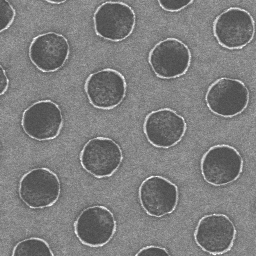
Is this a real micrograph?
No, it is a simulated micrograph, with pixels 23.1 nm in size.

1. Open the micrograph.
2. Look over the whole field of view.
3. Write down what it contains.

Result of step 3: a regular array of raised bodies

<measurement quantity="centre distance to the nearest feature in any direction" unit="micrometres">1.57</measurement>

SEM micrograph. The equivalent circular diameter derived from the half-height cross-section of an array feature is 909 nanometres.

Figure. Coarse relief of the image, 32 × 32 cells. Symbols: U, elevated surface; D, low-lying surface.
UDDDDDDDDDDDDUUDDDDDUUUDDDDDDDDD
UUDDDDDDDDDDUUUUUDDDDDDDDDDDUUUD
UDDDDDDDDDDDUUUUUDDDDDDDDDDUUUUU
UDDDDDDDDDDDUUUUUDDDDDDDDDDUUUUU
DDDDDUUUDDDDDUUUDDDDDDDDDDDUUUUU
DDDDUUUUDDDDDDDDDDDDUUUDDDDDUUUD
DDDDUUUUUDDDDDDDDDDUUUUUDDDDDDDD
DDDDUUUUDDDDDDDDDDDUUUUUDDDDDDDD
DDDDDUUDDDDDDDDDDDDUUUUDDDDDDDDD
UDDDDDDDDDDUUUUDDDDDUUDDDDDDDDDD
UDDDDDDDDDDUUUUUDDDDDDDDDDDUUUDD
DDDDDDDDDDDUUUUUDDDDDDDDDDUUUUUD
DDDDDDDDDDDUUUUDDDDDDDDDDDUUUUUD
DDDDUUUDDDDDDUDDDDDDDDDDDDUUUUUD
DDDUUUUUDDDDDDDDDDDUUUDDDDDDUDDD
DDDUUUUUDDDDDDDDDDUUUUUDDDDDDDDD
DDDUUUUDDDDDDDDDDDUUUUUDDDDDDDDD
DDDDDDDDDDDUUUDDDDDUUUDDDDDDDDDD
DDDDDDDDDDDUUUUDDDDDDDDDDDDUUDDD
DDDDDDDDDDUUUUUDDDDDDDDDDDUUUUDD
DDDDDDDDDDUUUUUDDDDDDDDDDUUUUUDD
DDDDUUDDDDDUUUDDDDDDDDDDDUUUUUDD
DDDUUUUDDDDDDDDDDDUUUDDDDDUUUDDD
DDUUUUUDDDDDDDDDDDUUUUDDDDDDDDDD
DDDUUUUDDDDDDDDDDUUUUUDDDDDDDDDD
DDDUUUDDDDDDDDDDDDUUUUDDDDDDDDDD
DDDDDDDDDDUUUUDDDDUUUDDDDDDDDDDD
DDDDDDDDDDUUUUDDDDDDDDDDDUUUUDDD
DDDDDDDDDUUUUUDDDDDDDDDDDUUUUDDD
DDDDDDDDDDUUUUDDDDDDDDDDUUUUUDDD
DDUUUUDDDDDUUDDDDDDDDDDDDUUUUDDD
DDUUUUDDDDDDDDDDDUUUUDDDDDUUDDDD